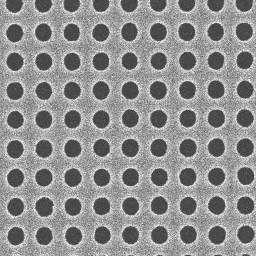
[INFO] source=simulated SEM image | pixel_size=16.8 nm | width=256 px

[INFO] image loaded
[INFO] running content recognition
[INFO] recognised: a regular array of holes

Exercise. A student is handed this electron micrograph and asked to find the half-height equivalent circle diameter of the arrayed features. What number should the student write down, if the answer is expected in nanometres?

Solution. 300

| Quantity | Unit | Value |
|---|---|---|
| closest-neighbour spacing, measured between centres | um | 0.478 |